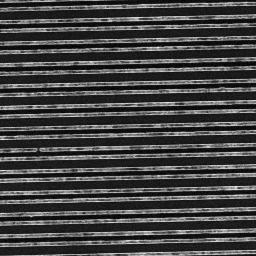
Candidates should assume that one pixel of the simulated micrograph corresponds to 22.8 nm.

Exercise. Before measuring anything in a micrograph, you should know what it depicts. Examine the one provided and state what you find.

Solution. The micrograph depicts parallel lines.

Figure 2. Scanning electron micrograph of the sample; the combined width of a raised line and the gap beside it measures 244 nanometers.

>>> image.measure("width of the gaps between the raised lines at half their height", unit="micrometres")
0.193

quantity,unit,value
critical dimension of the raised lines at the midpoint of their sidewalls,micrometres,0.0768